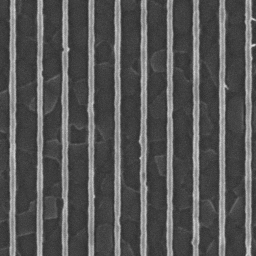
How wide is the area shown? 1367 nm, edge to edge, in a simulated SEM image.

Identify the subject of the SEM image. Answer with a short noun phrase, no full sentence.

parallel lines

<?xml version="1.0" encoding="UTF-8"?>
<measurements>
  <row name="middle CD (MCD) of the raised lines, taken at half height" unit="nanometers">22.7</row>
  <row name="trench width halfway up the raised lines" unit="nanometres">114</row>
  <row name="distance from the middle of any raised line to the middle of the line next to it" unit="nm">140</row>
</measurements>